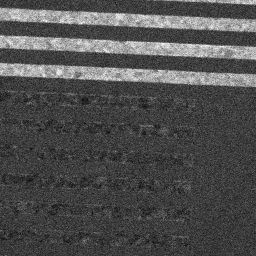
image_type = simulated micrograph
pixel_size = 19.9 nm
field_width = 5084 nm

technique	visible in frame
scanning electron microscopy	parallel lines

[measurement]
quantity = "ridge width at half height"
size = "236 nanometers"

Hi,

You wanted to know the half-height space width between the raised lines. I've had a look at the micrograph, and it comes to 308 nm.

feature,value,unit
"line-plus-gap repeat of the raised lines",544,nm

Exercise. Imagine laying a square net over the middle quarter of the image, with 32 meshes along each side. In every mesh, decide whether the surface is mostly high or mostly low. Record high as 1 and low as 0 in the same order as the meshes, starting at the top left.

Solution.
00000000000000000000000000000000
11111111111111111100000000000000
11111111111111111111111111111000
01111111111111111111111111111100
00000000000000000000000111111111
00000000000000000000000000000000
00000000000000000000000000000000
00000000000000000000000000000000
11110011111111111111100000000000
11110011111111111101111111111111
00000011111111111111111111111111
00000000000000000000000000111111
00000000000000000000000000000000
00000000000000000000000000000000
11000000000000000000000000000000
11111111111111111111111100000000
11111111111111111111111111111111
00000001111111111111111111111111
00000000000000000000000000100111
00000000000000000000000000000000
00000000000000000000000000000000
11111000000000000000000000000000
11111111111111110111111111100000
11111111111111110011111111111111
00000000001111101111111111111111
00000000000000000000000000000000
00000000000000000000000000000000
00000000000000000000000000000000
11111111000000000000000000000000
11111111111111111111111111111100
11111111111111111111111111111110
00000000000001111111111111111110